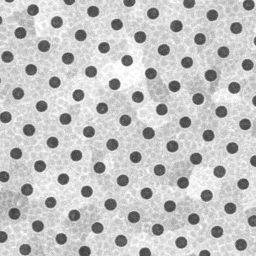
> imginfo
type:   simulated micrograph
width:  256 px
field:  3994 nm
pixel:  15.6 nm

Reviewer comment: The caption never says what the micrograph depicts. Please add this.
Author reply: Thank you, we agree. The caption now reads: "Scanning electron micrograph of a regular array of holes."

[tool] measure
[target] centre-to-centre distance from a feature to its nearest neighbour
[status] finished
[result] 26.6 px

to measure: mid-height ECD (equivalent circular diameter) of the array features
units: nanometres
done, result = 204